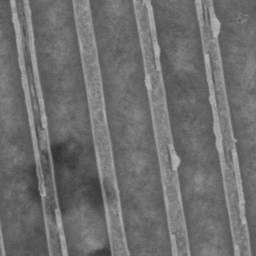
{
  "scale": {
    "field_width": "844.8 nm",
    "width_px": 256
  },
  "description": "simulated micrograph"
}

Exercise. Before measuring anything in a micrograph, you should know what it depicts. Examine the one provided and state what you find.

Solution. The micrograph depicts parallel lines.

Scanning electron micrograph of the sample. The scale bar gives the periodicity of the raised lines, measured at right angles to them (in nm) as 201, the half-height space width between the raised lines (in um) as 0.146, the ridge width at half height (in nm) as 53.4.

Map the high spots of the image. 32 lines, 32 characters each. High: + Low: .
.+++.....++......++.....++......
..++.....++......++......++.....
..++.....++......++......++.....
..++......++.....++......+++....
..++......++.....+++.....++.....
..++......++......++.....++.....
..++......++......++......+.....
..++......++......++......++....
...++.....++......++......++....
...++......++.....++......++....
...++......++.....++......++....
...++......++......++.....++....
...++......++......++.....++....
...+++.....++......++.....+++...
....++.....++......++......++...
....++.....++......++......++...
....++......++.....++......++...
....++......++.....+++.....++...
....++......++......++.....++...
....++......++......++......++..
.....++.....++......++......++..
.....++.....++......++......++..
.....++.....+++.....++......++..
.....++......++.....++......++..
.....++......++......++.....++..
.....++......++......++.....+++.
.....++......++......++......++.
......++.....++......++......++.
......++.....++......++......++.
......++......++.....++......++.
......++......++.....+++.....++.
+.....++......++......++.....++.